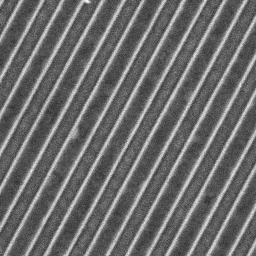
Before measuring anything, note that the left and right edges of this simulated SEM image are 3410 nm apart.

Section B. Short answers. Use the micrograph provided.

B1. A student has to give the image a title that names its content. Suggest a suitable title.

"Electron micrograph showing parallel lines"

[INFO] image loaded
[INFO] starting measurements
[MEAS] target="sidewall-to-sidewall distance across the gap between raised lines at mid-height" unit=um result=0.212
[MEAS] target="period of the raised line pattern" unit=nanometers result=476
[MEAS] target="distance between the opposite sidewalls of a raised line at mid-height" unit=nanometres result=259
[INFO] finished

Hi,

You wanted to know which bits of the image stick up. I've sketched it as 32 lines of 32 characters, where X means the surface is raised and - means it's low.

--XXX---XX---XX---XX---XX---XXX-
--XXX--XXX--XXX--XXX--XXX--XXX--
-XXX--XXX---XX---XX---XX---XX---
-XXX--XXX--XXX--XXX--XXX--XXX--X
XXX--XXX--XXX--XXX---XX---XX---X
XX---XX---XXX--XXX--XXX--XXX--XX
XX--XXX--XXX--XXX--XXX---XX---XX
X---XX---XXX--XXX--XXX--XXX--XXX
X--XXX--XXX--XXX--XXX---XX---XX-
---XX---XX---XX---XXX--XXX--XXX-
--XXX--XXX--XXX--XXX--XXX--XXX--
--XX---XX---XX---XX---XX---XXX--
-XXX--XXX--XXX--XXX--XXX--XXX--X
-XX--XXX---XX---XX---XX---XXX--X
XXX--XXX--XXX--XXX--XXX--XXX--XX
XX--XXX--XXX---XX---XX---XX---XX
X---XXX--XXX--XXX--XXX--XXX--XXX
X--XXX--XXX--XXX--XXX---XX---XX-
---XXX--XXX--XXX--XXX--XXX--XXX-
--XXX--XXX--XXX--XXX---XX---XX--
--XX---XXX--XXX--XXX--XXX--XXX--
-XXX--XXX--XXX--XXX--XXX---XX---
-XX---XX---XX---XXX--XXX--XXX--X
XXX--XXX--XXX--XXX--XXX--XXX--XX
XX---XX---XX---XX---XXX--XXX--XX
XX--XXX--XXX--XXX--XXX--XXX--XXX
X---XX---XX---XX---XX---XXX--XXX
X--XXX--XXX--XXX--XXX--XXX--XXX-
--XXX--XXX---XX---XX---XX---XXX-
--XXX--XXX--XXX--XXX--XXX--XXX--
-XXX--XXX--XXX---XX---XX---XXX--
-XXX--XXX--XXX--XXX--XXX--XXX--X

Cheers